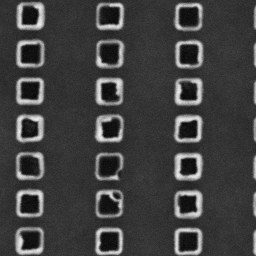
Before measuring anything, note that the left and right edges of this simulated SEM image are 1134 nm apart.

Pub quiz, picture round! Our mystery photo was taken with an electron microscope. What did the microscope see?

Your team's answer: a regular array of raised bodies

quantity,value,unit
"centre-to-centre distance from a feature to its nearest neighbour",166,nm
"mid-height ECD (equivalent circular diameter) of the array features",125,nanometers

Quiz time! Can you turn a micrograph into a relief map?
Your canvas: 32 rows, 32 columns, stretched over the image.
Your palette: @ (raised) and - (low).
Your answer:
---@@---------------------------
--@@@-------@@@-------@@@-------
--@@@-------@@@-------@@@-------
---@@--------@@-------@@@-------
--------------------------------
--@@@--------@@-------@@@-------
--@@@-------@@@-------@@@-------
--@@@-------@@@-------@@@-------
--------------------------------
--------------------------------
--@@@-------@@@-------@@@-------
--@@@-------@@@-------@@@-------
--@@@-------@@@-------@@@-------
--------------------------------
---@@---------------------------
--@@@-------@@@-------@@@-------
--@@@-------@@@-------@@@-------
---@@--------@@-------@@@-------
--------------------------------
--@@@-------@@@-------@@@-------
--@@@-------@@@-------@@@-------
--@@@-------@@@-------@@@-------
--------------------------------
--------------------------------
--@@@-------@@--------@@@-------
--@@@-------@@@-------@@@-------
--@@@-------@@@-------@@@-------
--------------------------------
--------------------------------
--@@@-------@@@-------@@@-------
--@@@-------@@@-------@@@-------
--@@@-------@@@-------@@@-------